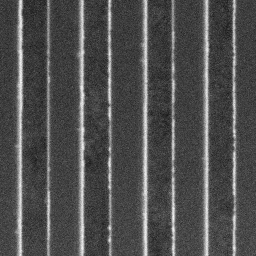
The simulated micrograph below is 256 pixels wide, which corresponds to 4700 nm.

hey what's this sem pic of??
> lines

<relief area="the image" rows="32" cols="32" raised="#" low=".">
###...####....####....####...###
###...####....####....####...###
###...####....####....####...###
###...####....####....####...###
##....####....####....####...###
##....####....####....####...###
###...####....####....####...###
###...####....####....####...###
###...####....####....####...###
###...####....####....####...###
###...####....####....####...###
##....####....####....####...###
###...####....####....####...###
###...####....####....####...###
##....####....####....####...###
##....####....####....####...###
##....####....####....####...###
##....####....####....####...###
##....####....####....####...###
##....####....####....####...###
##....####....####....####...###
##....####....####....####...###
##....####....####....####...###
##....####....####....####...###
##....####....####....####...###
##....####....####....####...###
##....####....####....####...###
##....####....####....####...###
##....####....####....####...###
##....####....####....####...###
##....####....####....####...###
##....####....####....####...###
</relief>